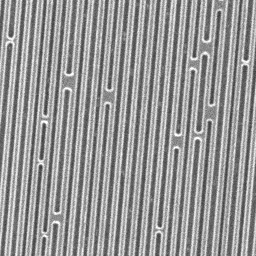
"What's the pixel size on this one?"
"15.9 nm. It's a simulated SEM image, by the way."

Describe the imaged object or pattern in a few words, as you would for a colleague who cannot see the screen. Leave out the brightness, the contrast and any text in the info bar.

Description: parallel lines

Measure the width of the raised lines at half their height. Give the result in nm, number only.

77.2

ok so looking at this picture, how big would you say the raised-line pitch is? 163 nm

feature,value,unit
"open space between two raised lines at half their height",0.093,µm